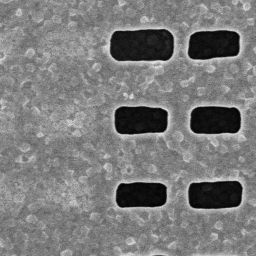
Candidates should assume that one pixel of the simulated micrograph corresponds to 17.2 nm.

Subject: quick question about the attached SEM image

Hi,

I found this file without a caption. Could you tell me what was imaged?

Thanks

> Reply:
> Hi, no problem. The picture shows holes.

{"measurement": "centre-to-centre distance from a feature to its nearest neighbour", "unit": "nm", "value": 1280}